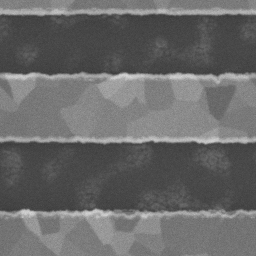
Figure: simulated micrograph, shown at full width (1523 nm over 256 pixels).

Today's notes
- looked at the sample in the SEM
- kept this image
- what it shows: one or a few lines or trenches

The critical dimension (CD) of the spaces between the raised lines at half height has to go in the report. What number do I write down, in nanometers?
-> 400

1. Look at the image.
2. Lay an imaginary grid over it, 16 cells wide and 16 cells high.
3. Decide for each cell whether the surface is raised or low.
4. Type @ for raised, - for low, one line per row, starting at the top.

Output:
@@@@@@@@@@@@@@@@
----------------
----------------
----------------
----------------
@@@@@@@@@@@@@@@@
@@@@@@@@@@@@@@@@
@@@@@@@@@@@@@@@@
@@@@@@@@@@@@@@@@
----------------
----------------
----------------
----------------
@@@@@@@@@@@@@@@@
@@@@@@@@@@@@@@@@
@@@@@@@@@@@@@@@@